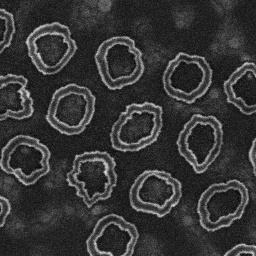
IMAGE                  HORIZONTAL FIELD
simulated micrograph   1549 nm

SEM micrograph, a regular array of ring-shaped raised bodies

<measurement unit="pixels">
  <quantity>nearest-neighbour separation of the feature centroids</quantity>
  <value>64.9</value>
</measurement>